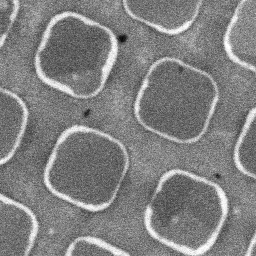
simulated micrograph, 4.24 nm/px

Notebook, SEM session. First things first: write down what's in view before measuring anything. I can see raised bodies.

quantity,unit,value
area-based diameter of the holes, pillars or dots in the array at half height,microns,0.341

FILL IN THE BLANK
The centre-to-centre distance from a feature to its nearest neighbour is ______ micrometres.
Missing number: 0.465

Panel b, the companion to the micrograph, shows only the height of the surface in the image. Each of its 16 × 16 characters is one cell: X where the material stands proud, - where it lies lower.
X-------XXXX---X
X--XXX---XXX--XX
---XXXX-------XX
--XXXXX-------XX
--XXXXX--XXXX---
----XX---XXXXX--
X-------XXXXX---
XX-------XXXX--X
X---XXX---XX---X
X--XXXXX-------X
---XXXXX-------X
---XXXXX--XXX---
X---XXX--XXXXX--
XX-------XXXXX--
XX-------XXXXX--
XX--XXX----XX---